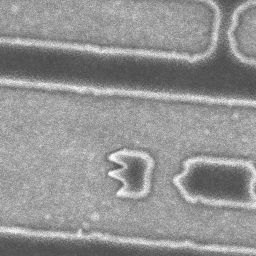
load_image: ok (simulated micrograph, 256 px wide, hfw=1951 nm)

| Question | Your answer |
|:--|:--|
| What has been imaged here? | one or a few lines or trenches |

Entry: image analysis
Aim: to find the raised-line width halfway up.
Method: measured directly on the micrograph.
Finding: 0.335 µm